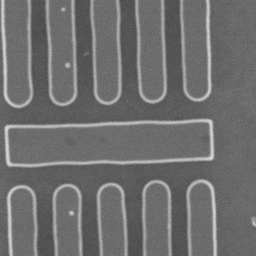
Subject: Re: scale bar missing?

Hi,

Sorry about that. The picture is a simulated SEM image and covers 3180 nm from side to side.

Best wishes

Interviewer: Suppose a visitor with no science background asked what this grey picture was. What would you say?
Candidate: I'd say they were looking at groups of lines, slits or small figures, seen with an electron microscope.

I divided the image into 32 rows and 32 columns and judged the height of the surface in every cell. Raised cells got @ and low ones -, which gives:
@@@@--@@@---@@@--@@@---@@@------
@@@@--@@@---@@@--@@@---@@@------
@@@@--@@@---@@@--@@@---@@@------
@@@@--@@@---@@@--@@@---@@@------
@@@@--@@@---@@@--@@@---@@@------
-@@@--@@@---@@@--@@@---@@@------
-@@@--@@@---@@@--@@@---@@@------
-@@@--@@@---@@@--@@@@--@@@------
-@@@--@@@---@@@--@@@@--@@@------
-@@@--@@@---@@@--@@@@--@@@------
-@@@--@@@---@@@--@@@@--@@@------
-@@@--@@@---@@@---@@@--@@@------
-@@@---@@---@@----@@------------
--------------------------------
--------------------------------
-------------@@@@@@@@@@@@@------
-@@@@@@@@@@@@@@@@@@@@@@@@@------
-@@@@@@@@@@@@@@@@@@@@@@@@@------
-@@@@@@@@@@@@@@@@@@@@@@@@@------
-@@@@@@@@@@@@@@@@@@@@@@@@@------
-@@@@@--------------------------
--------------------------------
--------------------------------
--@@---@@----@@---@@@---@@------
-@@@---@@@--@@@---@@@--@@@@-----
-@@@---@@@--@@@---@@@---@@@-----
-@@@---@@@--@@@@--@@@---@@@-----
-@@@---@@@--@@@@--@@@---@@@-----
-@@@---@@@--@@@@--@@@---@@@-----
-@@@---@@@--@@@@--@@@---@@@-----
-@@@---@@@---@@@--@@@---@@@-----
-@@@---@@@---@@@--@@@---@@@-----